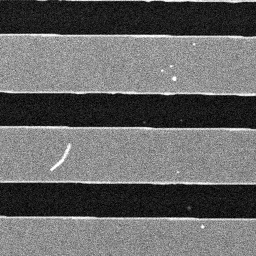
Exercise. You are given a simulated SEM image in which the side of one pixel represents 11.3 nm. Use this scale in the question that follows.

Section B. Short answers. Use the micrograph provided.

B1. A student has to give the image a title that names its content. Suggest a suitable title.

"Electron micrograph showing lines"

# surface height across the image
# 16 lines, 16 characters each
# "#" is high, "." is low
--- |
................
................
################
################
################
################
................
................
################
################
################
................
................
................
################
################